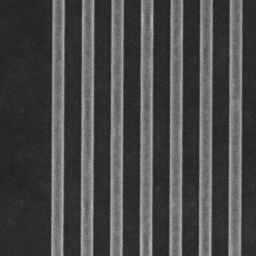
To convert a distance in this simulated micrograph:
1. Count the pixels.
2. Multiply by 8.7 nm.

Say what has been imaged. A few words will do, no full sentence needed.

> parallel lines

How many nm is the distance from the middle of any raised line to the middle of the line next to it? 257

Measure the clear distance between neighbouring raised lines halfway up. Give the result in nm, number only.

154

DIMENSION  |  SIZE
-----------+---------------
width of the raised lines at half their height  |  103 nm